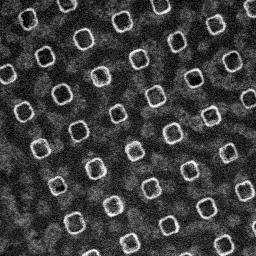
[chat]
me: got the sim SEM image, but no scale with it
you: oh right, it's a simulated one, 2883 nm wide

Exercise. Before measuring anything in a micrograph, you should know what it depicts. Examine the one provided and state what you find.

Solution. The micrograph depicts a regular array of raised bodies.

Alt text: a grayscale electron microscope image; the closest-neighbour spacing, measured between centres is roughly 0.461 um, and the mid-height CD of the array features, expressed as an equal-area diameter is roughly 204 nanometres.